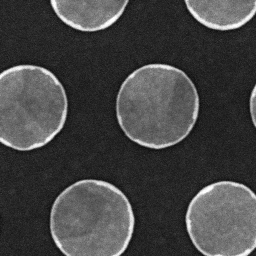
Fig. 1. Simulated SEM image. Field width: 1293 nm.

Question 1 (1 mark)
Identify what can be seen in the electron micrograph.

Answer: raised bodies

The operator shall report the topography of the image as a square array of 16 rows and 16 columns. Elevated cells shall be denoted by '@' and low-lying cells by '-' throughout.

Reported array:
---@@@@@----@@@@
----@@@------@@-
----------------
----------------
@@@-----@@@-----
@@@@----@@@@----
@@@@---@@@@@----
@@@@---@@@@@----
@@@-----@@@@----
----------------
----------------
-----@@-------@-
----@@@@----@@@@
---@@@@@----@@@@
---@@@@@----@@@@
----@@@@----@@@@